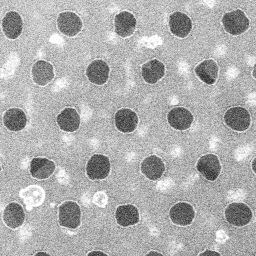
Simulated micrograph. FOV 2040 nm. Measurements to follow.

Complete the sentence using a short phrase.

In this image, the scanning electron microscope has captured a regular array of raised bodies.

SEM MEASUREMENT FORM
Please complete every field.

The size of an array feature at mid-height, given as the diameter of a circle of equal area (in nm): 207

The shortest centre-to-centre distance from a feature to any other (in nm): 432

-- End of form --